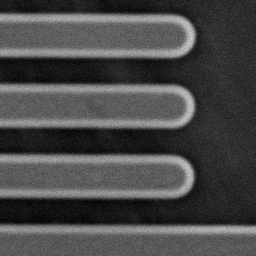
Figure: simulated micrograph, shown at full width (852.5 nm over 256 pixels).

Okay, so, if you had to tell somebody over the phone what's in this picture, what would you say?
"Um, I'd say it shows groups of lines, slits or small figures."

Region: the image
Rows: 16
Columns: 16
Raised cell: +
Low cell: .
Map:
................
++++++++++++....
++++++++++++....
................
................
................
++++++++++++....
+++++++++++.....
................
................
++++++++++++....
++++++++++++....
................
................
++++++++++++++++
++++++++++++++++